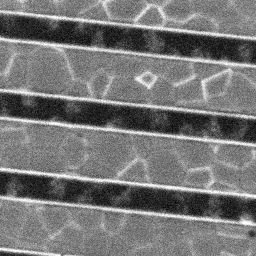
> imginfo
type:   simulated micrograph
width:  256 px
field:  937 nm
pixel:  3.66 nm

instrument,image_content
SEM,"one or a few lines or trenches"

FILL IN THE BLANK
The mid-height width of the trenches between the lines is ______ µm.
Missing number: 0.18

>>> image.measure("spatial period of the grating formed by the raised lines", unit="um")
0.288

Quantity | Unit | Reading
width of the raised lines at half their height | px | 29.5